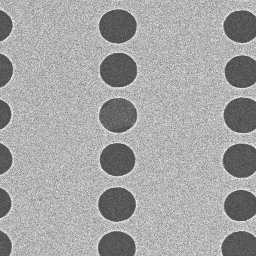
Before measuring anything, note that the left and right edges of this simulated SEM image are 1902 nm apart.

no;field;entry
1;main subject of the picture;holes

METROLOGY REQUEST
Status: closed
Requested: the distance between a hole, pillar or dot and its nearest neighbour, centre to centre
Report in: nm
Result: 330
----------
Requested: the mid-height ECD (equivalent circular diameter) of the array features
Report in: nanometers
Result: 265